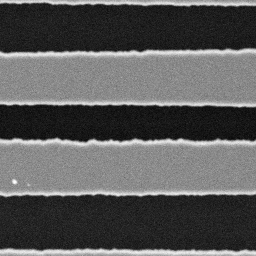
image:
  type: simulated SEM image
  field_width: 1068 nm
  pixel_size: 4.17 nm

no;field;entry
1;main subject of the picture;lines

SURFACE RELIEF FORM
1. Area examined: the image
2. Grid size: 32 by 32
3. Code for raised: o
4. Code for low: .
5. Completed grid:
......oooooo.ooooooooooooooooooo
................................
................................
................................
................................
................................
......o.ooo..ooooooooooooooooooo
oooooooooooooooooooooooooooooooo
oooooooooooooooooooooooooooooooo
oooooooooooooooooooooooooooooooo
oooooooooooooooooooooooooooooooo
oooooooooooooooooooooooooooooooo
oooooooooooooooooooooooooooooooo
................................
................................
................................
................................
ooooo.ooo..o....oo..oooo...o....
oooooooooooooooooooooooooooooooo
oooooooooooooooooooooooooooooooo
oooooooooooooooooooooooooooooooo
oooooooooooooooooooooooooooooooo
oooooooooooooooooooooooooooooooo
oooooooooooooooooooooooooooooooo
................................
................................
................................
................................
................................
................................
................................
oooooooooooooooooooooooooooooooo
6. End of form